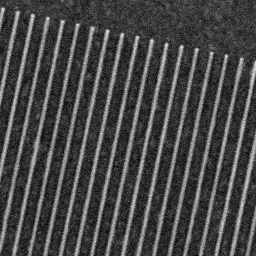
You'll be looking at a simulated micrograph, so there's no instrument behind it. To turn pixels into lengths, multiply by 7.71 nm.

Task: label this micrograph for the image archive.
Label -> parallel lines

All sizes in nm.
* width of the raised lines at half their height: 22.6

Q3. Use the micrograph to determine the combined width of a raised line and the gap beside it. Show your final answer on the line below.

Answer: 0.117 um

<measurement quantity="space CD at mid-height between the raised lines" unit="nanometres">97.1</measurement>